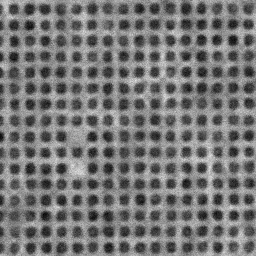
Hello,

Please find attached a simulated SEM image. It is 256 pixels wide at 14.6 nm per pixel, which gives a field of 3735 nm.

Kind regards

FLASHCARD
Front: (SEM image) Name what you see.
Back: a regular array of holes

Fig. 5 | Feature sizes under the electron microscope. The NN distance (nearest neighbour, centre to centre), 225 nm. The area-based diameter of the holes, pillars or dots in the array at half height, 171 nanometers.